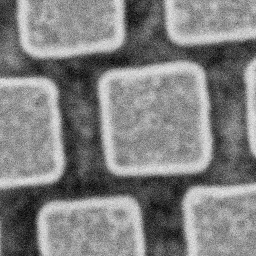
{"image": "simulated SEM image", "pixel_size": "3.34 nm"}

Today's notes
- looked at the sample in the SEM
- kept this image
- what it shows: raised bodies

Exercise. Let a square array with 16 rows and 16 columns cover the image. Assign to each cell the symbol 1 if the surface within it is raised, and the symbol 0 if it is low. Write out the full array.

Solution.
0111111000011111
0111111100011111
0111111000011000
0000000000000000
0000000001110000
1110001111111000
1110001111111000
1111000111111000
1111000111111000
1111000111111000
1111000111110000
1000000000000000
0000000000001111
0001111110001111
0001111110001111
0001111110001111